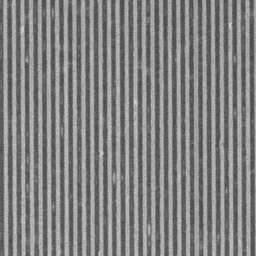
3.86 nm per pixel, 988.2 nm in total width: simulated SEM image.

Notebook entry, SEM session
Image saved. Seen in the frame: parallel lines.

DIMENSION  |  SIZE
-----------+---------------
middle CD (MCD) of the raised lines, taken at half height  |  13.5 nm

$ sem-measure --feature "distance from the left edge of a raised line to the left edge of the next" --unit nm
33.4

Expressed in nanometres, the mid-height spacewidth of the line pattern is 20.3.